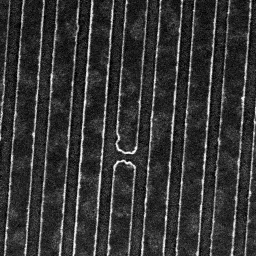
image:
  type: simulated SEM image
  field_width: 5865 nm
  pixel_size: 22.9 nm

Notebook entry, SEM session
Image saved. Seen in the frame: parallel lines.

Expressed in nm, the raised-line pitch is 786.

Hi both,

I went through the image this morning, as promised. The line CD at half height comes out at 503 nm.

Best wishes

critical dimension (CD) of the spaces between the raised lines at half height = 283 nanometers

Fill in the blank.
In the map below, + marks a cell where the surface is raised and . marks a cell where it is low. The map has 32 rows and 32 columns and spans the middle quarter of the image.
++....+++++....+++++...+++++....
++....+++++...++++++...+++++...+
++....+++++...++++++...+++++...+
++....+++++...+++++....+++++...+
++....+++++...+++++....+++++...+
++....+++++...+++++....+++++...+
++....+++++...+++++....+++++...+
++...++++++...+++++...++++++...+
++...+++++....+++++...++++++...+
++...+++++....+++++...++++++...+
++...+++++....+++++...++++++...+
++...+++++....+++++...+++++....+
++...+++++...++++++...+++++....+
++...+++++...++++++...+++++....+
+....+++++...++++++...+++++....+
+....+++++...++++++...+++++...++
+....+++++...+++++....+++++...++
+....+++++...+++++....+++++...++
+....+++++....++++....+++++...++
+....+++++...+++++....+++++...++
+....+++++...+++++...++++++...++
+...++++++....++++...++++++...++
+...+++++............++++++...++
+...+++++............++++++...++
+...+++++....+++.....++++++...++
+...+++++....+++++...+++++....++
+...+++++...++++++...+++++....++
....+++++...++++++...+++++....++
....+++++...++++++...+++++...+++
....+++++...++++++...+++++...+++
....+++++...+++++....+++++...+++
....+++++...+++++....+++++...+++